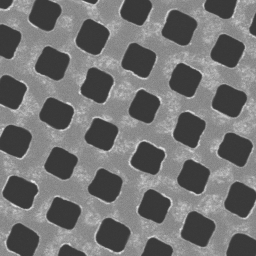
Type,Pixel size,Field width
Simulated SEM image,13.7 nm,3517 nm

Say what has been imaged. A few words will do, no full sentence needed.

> a regular array of holes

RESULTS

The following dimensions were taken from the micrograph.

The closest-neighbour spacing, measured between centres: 668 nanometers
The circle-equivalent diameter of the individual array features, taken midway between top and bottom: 440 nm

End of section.